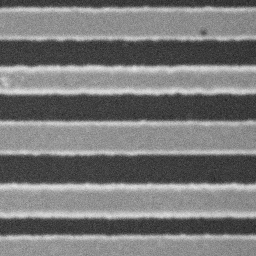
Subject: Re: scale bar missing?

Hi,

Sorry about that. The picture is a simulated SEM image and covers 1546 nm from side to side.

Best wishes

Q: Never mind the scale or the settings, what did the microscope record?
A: lines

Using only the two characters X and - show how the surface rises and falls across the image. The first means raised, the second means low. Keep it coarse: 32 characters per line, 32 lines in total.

--------------------------------
XXXXXXXXXXXXXXXXXXXXXXXXXXXXXXXX
XXXXXXXXXXXXXXXXXXXXXXXXXXXXXXXX
XXXXXXXXXXXXXXXXXXXXXXXXXXXXXXXX
XXXXXXXXXXXXXXXXXXXXXXXXXXXXXXXX
--------------------------------
--------------------------------
--------------------------------
-XXX-XXXXXXXXXXXXX-XX-XXXXXXXXXX
XXXXXXXXXXXXXXXXXXXXXXXXXXXXXXXX
XXXXXXXXXXXXXXXXXXXXXXXXXXXXXXXX
XXXXXXXXXXXXXXXXXXXXXX-XXXX--XXX
--------------------------------
--------------------------------
--------------------------------
XXXXXXXXXXXXXXXXXXXXXXXXXXXXXXXX
XXXXXXXXXXXXXXXXXXXXXXXXXXXXXXXX
XXXXXXXXXXXXXXXXXXXXXXXXXXXXXXXX
XXXXXXXXXXXXXXXXXXXXXXXXXXXXXXXX
--------------------------------
--------------------------------
--------------------------------
--------------------------------
XXXXXXXXXXXXXXXXXXXXXXXXXXXXXXXX
XXXXXXXXXXXXXXXXXXXXXXXXXXXXXXXX
XXXXXXXXXXXXXXXXXXXXXXXXXXXXXXXX
XXXXXXXXXXXXXXXXXXXXXXXXXXXXXXXX
--------------------------------
--------------------------------
-XXXXXXXXXXXXXXXXXXXXXXXXXXXXXXX
XXXXXXXXXXXXXXXXXXXXXXXXXXXXXXXX
XXXXXXXXXXXXXXXXXXXXXXXXXXXXXXXX